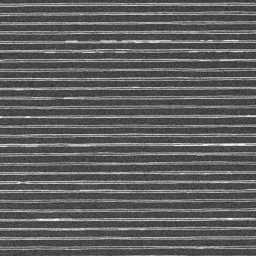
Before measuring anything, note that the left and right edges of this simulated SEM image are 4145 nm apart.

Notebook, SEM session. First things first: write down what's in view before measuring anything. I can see parallel lines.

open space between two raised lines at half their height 117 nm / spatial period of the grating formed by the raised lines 0.151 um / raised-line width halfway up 36.4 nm